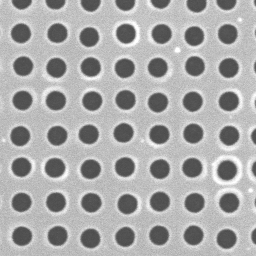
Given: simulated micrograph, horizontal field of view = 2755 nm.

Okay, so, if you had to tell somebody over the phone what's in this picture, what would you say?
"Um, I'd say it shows a regular array of holes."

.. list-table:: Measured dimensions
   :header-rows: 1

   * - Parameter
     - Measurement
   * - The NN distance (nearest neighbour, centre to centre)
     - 0.351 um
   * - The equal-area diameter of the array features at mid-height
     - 20.2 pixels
